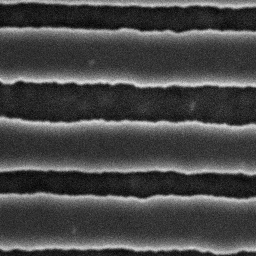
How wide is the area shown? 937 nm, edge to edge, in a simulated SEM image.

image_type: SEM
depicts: lines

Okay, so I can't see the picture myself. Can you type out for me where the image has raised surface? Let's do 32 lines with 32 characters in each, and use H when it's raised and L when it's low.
LLLLLLLLHHHHHHHHHHHHHHHHHHHHHHHH
LLLLLLLLLLLLLLLLLLLLLLLLLLLLLLLL
LLLLLLLLLLLLLLLLLLLLLLLLLLLLLLLL
LLLHLHHLLLLLLLLLLLLLLLLLLLLLLLLL
HHHHHHHHHHHHHHHHHHHHHHHHHHHHHHHH
HHHHHHHHHHHHHHHHHHHHHHHHHHHHHHHH
HHHHHHHHHHHHHHHHHHHHHHHHHHHHHHHH
HHHHHHHHHHHHHHHHHHHHHHHHHHHHHHHH
HHHHHHHHHHHHHHHHHHHHHHHHHHHHHHHH
HHHHHHHHHHHHHHHHHHHHHHHHHHHHHHHH
LLLLLLLLLLLLLLLLHHHHHHHHHHHHHHHH
LLLLLLLLLLLLLLLLLLLLLLLLLLLLLLLL
LLLLLLLLLLLLLLLLLLLLLLLLLLLLLLLL
LLLLLLLLLLLLLLLLLLLLLLLLLLLLLLLL
LLLLLLLLLLLLLLLLLLLLLLLLLLLLLLLL
HHHHHHHHHHHHHHHHHHHHHHHHHHLLLLLL
HHHHHHHHHHHHHHHHHHHHHHHHHHHHHHHH
HHHHHHHHHHHHHHHHHHHHHHHHHHHHHHHH
HHHHHHHHHHHHHHHHHHHHHHHHHHHHHHHH
HHHHHHHHHHHHHHHHHHHHHHHHHHHHHHHH
HHHHHHHHHHHHHHHHHHHHHHHHHHHHHHHH
LLLLLLLLLLLHHLLHLLLLLLHHHHHHHHHH
LLLLLLLLLLLLLLLLLLLLLLLLLLLLLLLL
LLLLLLLLLLLLLLLLLLLLLLLLLLLLLLLL
HHHHHHHHHHHHLLLLLLLHLHLLHHLLLLLL
HHHHHHHHHHHHHHHHHHHHHHHHHHHHHHHH
HHHHHHHHHHHHHHHHHHHHHHHHHHHHHHHH
HHHHHHHHHHHHHHHHHHHHHHHHHHHHHHHH
HHHHHHHHHHHHHHHHHHHHHHHHHHHHHHHH
HHHHHHHHHHHHHHHHHHHHHHHHHHHHHHHH
HHHHHHHHHHHHHHHHHHHHHHHHHHHHHHHH
LLLLLLLLLLLLLLLLLLLLLLLLLLHHHHLL